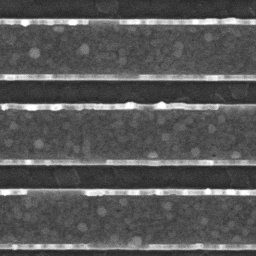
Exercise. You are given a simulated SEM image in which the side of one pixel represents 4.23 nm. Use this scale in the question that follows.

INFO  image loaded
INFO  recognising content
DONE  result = one or a few lines or trenches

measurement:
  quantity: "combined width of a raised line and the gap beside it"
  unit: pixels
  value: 84.7